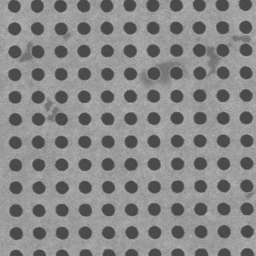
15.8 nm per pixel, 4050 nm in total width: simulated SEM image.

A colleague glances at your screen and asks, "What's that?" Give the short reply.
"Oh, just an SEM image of a regular array of holes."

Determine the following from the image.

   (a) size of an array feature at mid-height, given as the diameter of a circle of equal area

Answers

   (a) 206 nanometres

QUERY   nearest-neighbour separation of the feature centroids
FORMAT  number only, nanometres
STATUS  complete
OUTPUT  356